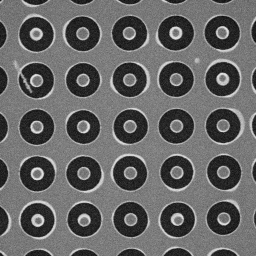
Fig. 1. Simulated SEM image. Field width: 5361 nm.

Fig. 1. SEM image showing an array of small figures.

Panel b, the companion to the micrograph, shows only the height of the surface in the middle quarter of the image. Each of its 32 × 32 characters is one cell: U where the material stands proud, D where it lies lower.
UUDDDDDUUUUUUUDDDDDUUUUUUDDDDDDU
UDDDDDDDUUUUUDDDDDDDUUUUDDDDDDDD
UDDDDDDDDUUUDDDDDDDDDUUUDDDDDDDD
DDDUUUDDDUUUDDDUUUDDDUUUDDDUUDDD
DDDUUUDDDUUUDDDUUUDDDUUUDDDUUDDD
UDDDDDDDDUUUDDDDDDDDDUUUDDDDDDDD
UDDDDDDDUUUUUDDDDDDDUUUUDDDDDDDD
UUDDDDDUUUUUUUDDDDDUUUUUUDDDDDDU
UUUUUUUUUUUUUUUUUUUUUUUUUUUUUUUU
UUUUUUUUUUUUUUUUUUUUUUUUUUUUUUUU
UUUUUUUUUUUUUUUUUUUUUUUUUUUUUUUU
UUUUDDUUUUUUUUUDDDDUUUUUUUDDDDUU
UUDDDDDDUUUUUUDDDDDDUUUUUDDDDDDU
UDDDDDDDUUUUUDDDDDDDDUUUDDDDDDDD
DDDDUDDDDUUUUDDDUDDDDUUUDDDUUDDD
DDDDUUDDDUUUDDDUUUDDDUUDDDDUUUDD
DDDDUUDDDUUUDDDUUUDDDUUUDDDUUDDD
UDDDDDDDDUUUUDDDDDDDDUUUDDDDDDDD
UDDDDDDDUUUUUDDDDDDDUUUUUDDDDDDU
UUUDDDDUUUUUUUDDDDDUUUUUUUDDDDUU
UUUUUUUUUUUUUUUUUUUUUUUUUUUUUUUU
UUUUUUUUUUUUUUUUUUUUUUUUUUUUUUUU
UUUUUUUUUUUUUUUUUUUUUUUUUUUUUUUU
UUUDDDDUUUUUUUDDDDDUUUUUUUDDDDDU
UUDDDDDDDUUUUDDDDDDDUUUUUDDDDDDD
UDDDDDDDDUUUDDDDDDDDUUUUDDDDDDDD
UDDDUUDDDUUUDDDUUUDDDUUUDDDUUUDD
DDDDUUDDDDUUDDDUUUDDDUUUDDDUUUDD
UDDDUUDDDDUUDDDDUDDDDUUUDDDUUDDD
UDDDDDDDDUUUUDDDDDDDUUUUUDDDDDDD
UUDDDDDDDUUUUUDDDDDDUUUUUUDDDDDU
UUUDDDDUUUUUUUUDDDUUUUUUUUUUDUUU